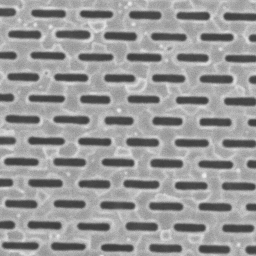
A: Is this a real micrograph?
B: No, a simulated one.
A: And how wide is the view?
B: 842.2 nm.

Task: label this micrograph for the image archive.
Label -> a regular array of holes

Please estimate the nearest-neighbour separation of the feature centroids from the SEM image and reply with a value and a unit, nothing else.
0.104 microns